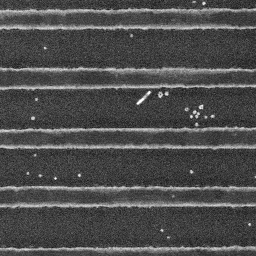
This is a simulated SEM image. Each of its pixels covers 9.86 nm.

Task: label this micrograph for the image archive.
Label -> lines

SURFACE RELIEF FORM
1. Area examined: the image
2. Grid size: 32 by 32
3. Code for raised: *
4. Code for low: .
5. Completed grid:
................................
********************************
********************************
................................
................................
................................
................................
................................
................................
********************************
********************************
................................
................................
................................
................................
................................
********************************
********************************
................................
................................
................................
................................
................................
*************.****************..
********************************
********************************
................................
................................
................................
................................
................................
********************************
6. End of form